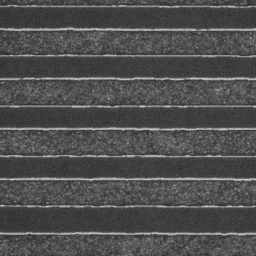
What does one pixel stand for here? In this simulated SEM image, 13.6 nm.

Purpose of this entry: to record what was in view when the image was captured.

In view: lines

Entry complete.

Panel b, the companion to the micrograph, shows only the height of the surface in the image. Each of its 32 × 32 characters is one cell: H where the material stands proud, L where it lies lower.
LLLLLLLLLLLLLLLLLLLLLLLLLLLLLLLL
HHHHHHHHHHHHHHHHHHHHHHHHHHHHHHHH
HHHHHHHHHHHHHHHHHHHHHHHHHHHHHHHH
HHHHHHHHHHHHHHHHHHHHHHHHHHHHHHHH
LLLLLLLLLLLLLLLLLLLLLLLLLLLLLLLL
LLLLLLLLLLLLLLLLLLLLLLLLLLLLLLLL
LLLLLLLLLLLLLLLLLLLLLLLLLLLLLLLL
HHHHHHHHHHHHHHHHHHHHHHHHHHHHHHHH
HHHHHHHHHHHHHHHHHHHHHHHHHHHHHHHH
HHHHHHHHHHHHHHHHHHHHHHHHHHHHHHHH
LLLLLLLLLLLLLLLLLLLLLLLLLLLLLLLL
LLLLLLLLLLLLLLLLLLLLLLLLLLLLLLLL
LLLLLLLLLLLLLLLLLLLLLLLLLLLLLLLL
HHHHHHHHHHHHHHHHHHHHHHHHHHHHHHHH
HHHHHHHHHHHHHHHHHHHHHHHHHHHHHHHH
HHHHHHHHHHHHHHHHHHHHHHHHHHHHHHHH
LLLLLLLLLLLLLLLLLLLLLLLLLLLLLLLL
LLLLLLLLLLLLLLLLLLLLLLLLLLLLLLLL
LLLLLLLLLLLLLLLLLLLLLLLLLLLLLLLL
HHHLLHHHHHHHHHLHHHHHHLLHLHHHLLLL
HHHHHHHHHHHHHHHHHHHHHHHHHHHHHHHH
HHHHHHHHHHHHHHHHHHHHHHHHHHHHHHHH
LLLLLLLLLLLLLLLLLLLLLLLLLLLLLLLL
LLLLLLLLLLLLLLLLLLLLLLLLLLLLLLLL
LLLLLLLLLLLLLLLLLLLLLLLLLLLLLLLL
LLLLLLLLLLLLLLLLLLLLLLLLLLLLLLLL
HHHHHHHHHHHHHHHHHHHHHHHHHHHHHHHH
HHHHHHHHHHHHHHHHHHHHHHHHHHHHHHHH
HHHHHHHHHHHHHHHHHHHHHHHHHHHHHHHH
LLLLLLLLLLLLLLLLLLLLLLLLLLLLLLLL
LLLLLLLLLLLLLLLLLLLLLLLLLLLLLLLL
LLLLLLLLLLLLLLLLLLLLLLLLLLLLLLLL